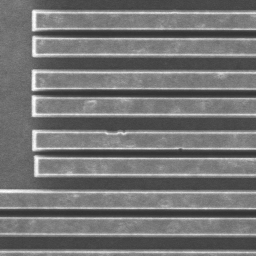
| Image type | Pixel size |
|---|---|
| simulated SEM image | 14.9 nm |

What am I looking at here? parallel lines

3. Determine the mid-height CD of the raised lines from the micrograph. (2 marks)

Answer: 280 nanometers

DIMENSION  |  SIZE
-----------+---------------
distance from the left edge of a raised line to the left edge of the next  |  430 nm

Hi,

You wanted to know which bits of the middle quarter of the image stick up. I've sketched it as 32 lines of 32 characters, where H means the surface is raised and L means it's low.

LLLLLLLLLLLLLLLLLLLLLLLLLLLLLLLL
LLLLLLLLLLLLLLLLLLLLLLLLLLLLLLLL
HHHHHHHHHHHHHHHHHHHHHHHHHHHHHHHH
HHHHHHHHHHHHHHHHHHHHHHHHHHHHHHHH
HHHHHHHHHHHHHHHHHHHHHHHHHHHHHHHH
HHHHHHHHHHHHHHHHHHHHHHHHHHHHHHHH
LLLLLLLLLLLLLLLLLLLLLLLLLLLLLLLL
LLLLLLLLLLLLLLLLLLLLLLLLLLLLLLLL
HHHHHHHHHHHHHHHHHHHHHHHHHHHHHHHH
HHHHHHHHHHHHHHHHHHHHHHHHHHHHHHHH
HHHHHHHHHHHHHHHHHHHHHHHHHHHHHHHH
HHHHHHHHHHHHHHHHHHHHHHHHHHHHHHHH
HHHHHHHHHHHHHHHHHHHHHHHHHHHHHHHH
LLLLLLLLLLLLLLLLLLLLLLLLLLLLLLLL
LLLLLLLLLLLLLLLLLLLLLLLLLLLLLLLL
LLLLLLLLLLLLLLLLLLLLLLLLLLLLLLLL
LLLLLLLLLLLLLLLLLLLLLLLLLLLLLLLL
HHHHHHHHHHHHHHHHHHHHHHHHHHHHHHHH
HHHHHHHHHHHHHHHHHHHHHHHHHHHHHHHH
HHHHHHHHHHHHHHHHHHHHHHHHHHHHHHHH
HHHHHHHHHHHHHHHHHHHHHHHHHHHHHHHH
LLLLLLLLLLLLLLLLLLLLLLLLLLLLLLLL
LLLLLLLLLLLLLLLLLLLLLLLLLLLLLLLL
HHHHHHHHHHHHHHHHHHHHHHHHHHHHHHLL
HHHHHHHHHHHHHHHHHHHHHHHHHHHHHHHH
HHHHHHHHHHHHHHHHHHHHHHHHHHHHHHHH
HHHHHHHHHHHHHHHHHHHHHHHHHHHHHHHH
HHHHHHHHHHHHHHHHHHHHHHHHHHHHHHHH
LLLLLLLLLLLLLLLLLLLLLLLLLLLLLLLL
LLLLLLLLLLLLLLLLLLLLLLLLLLLLLLLL
LLLLLLLLLLLLLLLLLLLLLLLLLLLLLLLL
LLLLLLLLLLLLLLLLLLLLLLLLLLLLLLLL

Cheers